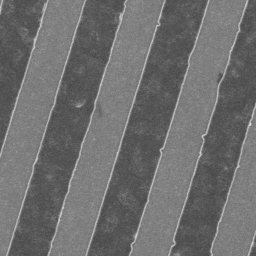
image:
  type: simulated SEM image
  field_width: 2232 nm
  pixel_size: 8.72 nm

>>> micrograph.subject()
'one or a few lines or trenches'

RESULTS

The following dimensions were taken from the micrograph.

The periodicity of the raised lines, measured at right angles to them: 668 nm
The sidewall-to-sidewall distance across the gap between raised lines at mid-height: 0.312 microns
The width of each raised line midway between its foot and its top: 40.5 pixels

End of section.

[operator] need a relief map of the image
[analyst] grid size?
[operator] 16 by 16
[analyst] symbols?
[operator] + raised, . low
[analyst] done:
+++..+++..+++..+
+++..++...+++..+
++...++...++...+
++..+++..+++..++
++..+++..+++..++
+...++...++...++
+..+++..+++..+++
+..+++..+++..+++
...++...++...++.
..+++..+++...++.
..+++..+++..+++.
..++...+++..+++.
.+++..+++...++..
.+++..+++..+++..
.++...+++..+++..
.++...++...++...